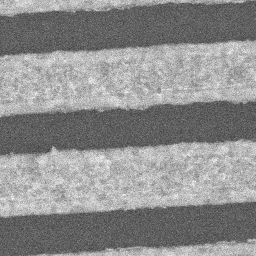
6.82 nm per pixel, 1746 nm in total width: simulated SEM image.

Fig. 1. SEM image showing one or a few lines or trenches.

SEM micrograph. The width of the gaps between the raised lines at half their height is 371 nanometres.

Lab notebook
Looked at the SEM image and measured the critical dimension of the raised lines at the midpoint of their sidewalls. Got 45.9 pixels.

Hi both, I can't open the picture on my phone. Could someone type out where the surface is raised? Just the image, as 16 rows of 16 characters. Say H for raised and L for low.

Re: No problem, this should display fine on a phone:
HLLLLLLLLLLLLLLL
LLLLLLLLLLLLLLLL
LLLLLLLLLLLLLLLL
LLLLLLLHHHHHHHHH
HHHHHHHHHHHHHHHH
HHHHHHHHHHHHHHHH
HHHHLLLLLLLLLLLL
LLLLLLLLLLLLLLLL
LLLLLLLLLLLLLLLL
LLLLLLLLLLHHHHHH
HHHHHHHHHHHHHHHH
HHHHHHHHHHHHHHHH
HHHHHHHHHHLLLLLL
LLLLLLLLLLLLLLLL
LLLLLLLLLLLLLLLL
LLLLLLLLLLLLLLLL